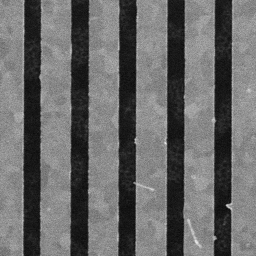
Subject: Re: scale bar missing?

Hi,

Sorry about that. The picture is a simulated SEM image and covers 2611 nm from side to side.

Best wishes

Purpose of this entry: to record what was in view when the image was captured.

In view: parallel lines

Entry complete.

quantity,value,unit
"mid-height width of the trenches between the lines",180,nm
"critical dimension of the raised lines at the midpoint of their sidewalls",0.301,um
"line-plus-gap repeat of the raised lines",488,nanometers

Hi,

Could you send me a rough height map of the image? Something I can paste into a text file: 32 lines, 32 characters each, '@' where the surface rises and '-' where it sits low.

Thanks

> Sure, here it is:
@@@--@@@@--@@@@--@@@@--@@@@--@@@
@@@--@@@@--@@@@--@@@@--@@@@--@@@
@@@--@@@@--@@@@--@@@@--@@@@--@@@
@@@--@@@@--@@@@--@@@@--@@@@--@@@
@@@--@@@@--@@@@--@@@@--@@@@--@@@
@@@--@@@@--@@@@--@@@@--@@@@--@@@
@@@--@@@@--@@@@--@@@@--@@@@--@@@
@@@--@@@@--@@@@--@@@@--@@@@--@@@
@@@--@@@@--@@@@--@@@@--@@@@--@@@
@@@--@@@@--@@@@--@@@@--@@@@--@@@
@@@--@@@@--@@@@--@@@@--@@@@--@@@
@@@--@@@@--@@@@--@@@@--@@@@--@@@
@@@--@@@@--@@@@--@@@@--@@@@--@@@
@@@--@@@@--@@@@--@@@@--@@@@--@@@
@@@--@@@@--@@@@--@@@@--@@@@--@@@
@@@--@@@@--@@@@--@@@@--@@@@--@@@
@@@--@@@@--@@@@--@@@@--@@@@--@@@
@@@--@@@@--@@@@--@@@@--@@@@--@@@
@@@--@@@@--@@@@--@@@@--@@@@--@@@
@@@--@@@@--@@@@--@@@@--@@@@--@@@
@@@--@@@@--@@@@--@@@@--@@@@--@@@
@@@--@@@@--@@@@--@@@@--@@@@--@@@
@@@--@@@@--@@@@--@@@@--@@@@--@@@
@@@--@@@@--@@@@--@@@@--@@@@--@@@
@@@--@@@@--@@@@--@@@@--@@@@--@@@
@@@--@@@@--@@@@--@@@@--@@@@--@@@
@@@--@@@@--@@@@--@@@@--@@@@--@@@
@@@--@@@@--@@@@--@@@@--@@@@--@@@
@@@--@@@@--@@@@--@@@@--@@@@--@@@
@@@--@@@@--@@@@--@@@@--@@@@--@@@
@@@--@@@@--@@@@--@@@@--@@@@--@@@
@@@--@@@@--@@@@--@@@@--@@@@--@@@